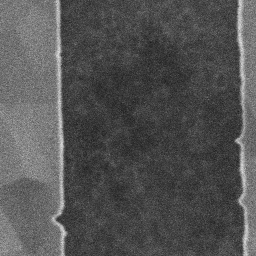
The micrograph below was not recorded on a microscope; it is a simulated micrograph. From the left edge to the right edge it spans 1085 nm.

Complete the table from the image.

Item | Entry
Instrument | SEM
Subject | one or a few lines or trenches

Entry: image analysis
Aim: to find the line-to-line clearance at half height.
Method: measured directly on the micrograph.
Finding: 768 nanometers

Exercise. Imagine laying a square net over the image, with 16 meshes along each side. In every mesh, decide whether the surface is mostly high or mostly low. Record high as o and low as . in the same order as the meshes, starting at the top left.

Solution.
oooo...........o
oooo...........o
oooo...........o
oooo...........o
oooo...........o
oooo...........o
oooo...........o
oooo...........o
oooo...........o
oooo...........o
oooo...........o
oooo...........o
oooo...........o
oooo...........o
oooo...........o
oooo...........o